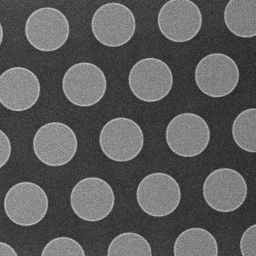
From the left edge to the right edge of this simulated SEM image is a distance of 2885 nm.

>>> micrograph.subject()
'an array of small figures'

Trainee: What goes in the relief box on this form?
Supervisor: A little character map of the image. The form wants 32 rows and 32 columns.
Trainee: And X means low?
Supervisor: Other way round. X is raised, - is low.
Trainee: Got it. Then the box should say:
--------------X------XXX-----XXX
----XXXX----XXXX----XXXXX---XXXX
---XXXXX----XXXXX---XXXXX---XXXX
---XXXXXX---XXXXX---XXXXX----XXX
---XXXXX----XXXX-----XXX------X-
----XXXX-----XX-----------------
--------------------------------
------------------XX-----XXXX---
--X------XXX-----XXXX----XXXXX--
XXXX----XXXXX---XXXXX---XXXXXX--
XXXXX---XXXXX---XXXXX----XXXXX--
XXXXX---XXXXX----XXXX----XXXX---
XXXXX----XXX------XX------------
-XX-----------------------------
----------------------XXX-----XX
------XX-----XXXX----XXXXX---XXX
-----XXXX----XXXXX---XXXXX---XXX
X---XXXXXX--XXXXXX---XXXXX---XXX
X---XXXXXX---XXXXX---XXXXX----XX
X----XXXX-----XXX------X--------
X-----XX------------------------
---------------------------XXX--
----------XXX-----XXXX----XXXX--
--XXX----XXXXX---XXXXX---XXXXXX-
-XXXXX---XXXXX---XXXXX----XXXXX-
-XXXXX---XXXXX---XXXXX----XXXX--
-XXXXX---XXXXX----XXX-----------
--XXX------X--------------------
-------------------------------X
---------------XXX----XXXXX---XX
X-----XXXX----XXXX----XXXXX---XX
XX---XXXXX----XXXXX---XXXXX---XX